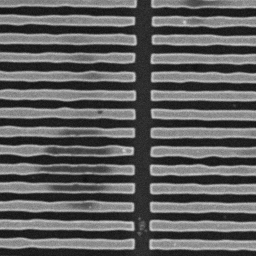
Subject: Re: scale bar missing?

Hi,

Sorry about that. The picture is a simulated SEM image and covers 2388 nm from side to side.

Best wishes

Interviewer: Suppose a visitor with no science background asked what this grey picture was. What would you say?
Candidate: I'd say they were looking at groups of lines, slits or small figures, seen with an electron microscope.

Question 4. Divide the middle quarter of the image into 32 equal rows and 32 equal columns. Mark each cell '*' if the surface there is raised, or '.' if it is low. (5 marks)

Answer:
................................
................................
******************....**********
******************....**********
............................**..
................................
................................
******************....**********
******************....**********
................................
................................
*****************.....***.......
******************....**********
............******......********
................................
................................
******************....**********
******************....**********
................................
................................
...........***..................
*****************.....**********
*****************.....**********
................................
................................
*****************.....**********
*****************.....**********
.........****.***.....**********
................................
................................
******************....**********
******************....**********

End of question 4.